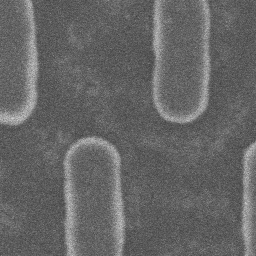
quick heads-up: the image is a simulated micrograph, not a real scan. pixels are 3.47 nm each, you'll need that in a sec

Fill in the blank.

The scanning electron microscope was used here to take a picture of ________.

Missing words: raised bodies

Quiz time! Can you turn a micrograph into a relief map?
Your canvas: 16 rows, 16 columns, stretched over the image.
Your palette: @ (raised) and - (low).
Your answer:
@@--------@@@---
@@--------@@@---
@@--------@@@---
@@--------@@@---
@@--------@@@---
@@--------@@@---
@@--------@@@---
@----------@----
----------------
----@@@--------@
----@@@--------@
----@@@--------@
----@@@@-------@
----@@@@-------@
----@@@@-------@
----@@@@-------@